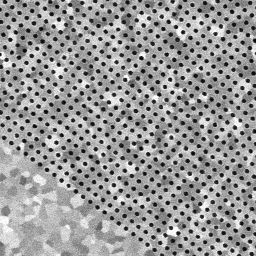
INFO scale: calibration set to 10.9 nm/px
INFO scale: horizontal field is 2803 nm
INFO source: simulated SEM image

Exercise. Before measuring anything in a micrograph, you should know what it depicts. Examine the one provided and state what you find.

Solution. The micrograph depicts a regular array of holes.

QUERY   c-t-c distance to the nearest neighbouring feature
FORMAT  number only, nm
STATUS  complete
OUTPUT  95.3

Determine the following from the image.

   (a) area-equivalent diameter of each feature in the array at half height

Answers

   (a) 52.4 nm